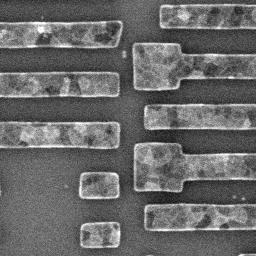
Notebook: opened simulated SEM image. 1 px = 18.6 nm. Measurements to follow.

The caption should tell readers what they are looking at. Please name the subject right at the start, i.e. wiring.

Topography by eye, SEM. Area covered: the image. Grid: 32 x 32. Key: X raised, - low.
--------------------------------
--------------------XXXXXXXXXXXX
--------------------XXXXXXXXXXXX
XXXXXXXXXXXXXXX-------------X---
XXXXXXXXXXXXXXX-----------------
XXXXXXXXXXXXXXX--XXXX-----------
-----------------XXXXXX---------
-----------------XXXXXXXXXXXXXXX
-----------------XXXXXXXXXXXXXXX
XXXXXXXXXXXXXXX--XXXXXXXXXXXXXXX
XXXXXXXXXXXXXXX--XXXXX----------
XXXXXXXXXXXXXXX-----------------
--------------------------------
------------------XXXXXXXXXXXXXX
------------------XXXXXXXXXXXXXX
XXXXXXXXXXXXXXX---XXXXXXXXXXXXXX
XXXXXXXXXXXXXXX-----------------
XXXXXXXXXXXXXXX-----------------
------------XX---XXXXXX---------
-----------------XXXXXXXXXXXXXXX
-----------------XXXXXXXXXXXXXXX
-----------------XXXXXXXXXXXXXXX
----------XXXXX--XXXXXXX--------
----------XXXXX--XXXXXX---------
----------XXXXX-----------------
--------------------------------
------------------XXXXXXXXXXXXXX
------------------XXXXXXXXXXXXXX
----------XXXXX---XXXXXXXXXXXXXX
----------XXXXX-----------------
----------XXXXX-----------------
--------------------------------